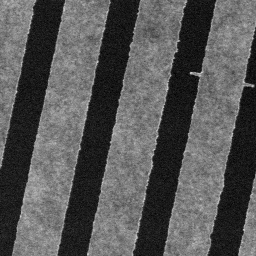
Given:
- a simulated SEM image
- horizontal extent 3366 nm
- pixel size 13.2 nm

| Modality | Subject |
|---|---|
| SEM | one or a few lines or trenches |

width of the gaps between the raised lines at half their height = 0.393 um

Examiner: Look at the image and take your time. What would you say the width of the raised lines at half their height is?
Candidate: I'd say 576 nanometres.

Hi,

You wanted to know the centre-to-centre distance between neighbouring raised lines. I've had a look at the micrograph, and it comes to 970 nm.